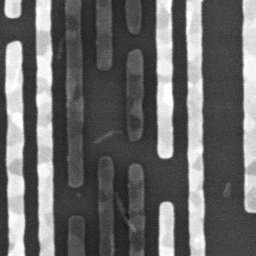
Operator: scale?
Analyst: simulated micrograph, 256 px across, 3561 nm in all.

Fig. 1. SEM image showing wiring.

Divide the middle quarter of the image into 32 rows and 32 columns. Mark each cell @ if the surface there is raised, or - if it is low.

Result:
-@@@----@@@@----@@@-----@@@----@
-@@@------------@@@----@@@@----@
-@@@------------@@@-----@@@----@
-@@@------------@@@-----@@@----@
-@@@------------@@@-----@@@----@
-@@@------------@@@@----@@@----@
-@@@------------@@@@----@@@----@
-@@@------------@@@@----@@@----@
-@@@------------@@@@---@@@@----@
-@@@@-----------@@@-----@@@----@
-@@@@-----------@@@-----@@@----@
-@@@------------@@@-----@@@----@
-@@@------------@@@-----@@@----@
-@@@------------@@@-----@@@----@
-@@@------------@@@-----@@@----@
-@@@------------@@@-----@@@----@
-@@@------------@@@-----@@@----@
-@@@------------@@@-----@@@----@
-@@@------------@@@-----@@@----@
-@@@--------------------@@@----@
-@@@--------------------@@@----@
-@@@--------------------@@@----@
-@@@--------------------@@@----@
-@@@-----@@--------------------@
-@@@-----@@@-------------------@
-@@@-----@@@-----@@------------@
-@@@@----@@@----@@@------------@
-@@@@----@@@----@@@@-----------@
-@@@@----@@@----@@@@-----------@
-@@@@----@@@----@@@@------------
--@@-----@@@----@@@@------------
---------@@@----@@@@------------